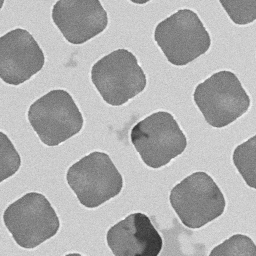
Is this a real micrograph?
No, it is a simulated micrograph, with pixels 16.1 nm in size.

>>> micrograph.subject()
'a regular array of holes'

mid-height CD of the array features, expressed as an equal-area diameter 53.8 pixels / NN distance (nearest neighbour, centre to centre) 1170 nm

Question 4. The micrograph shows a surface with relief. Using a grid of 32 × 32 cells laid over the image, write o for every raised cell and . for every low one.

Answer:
ooooooo......ooooooooooooooo....
oooooo.......ooooooooo..oooo....
ooooooo......ooooooo.....oooo...
ooooooo......oooooo.......oooooo
....oooo....ooooooo.......oooooo
.....oooo.oooooooooo......oooooo
.....ooooooooo..oooo......oooooo
......oooooo.....oooo...oooooooo
.....ooooooo......oooooooooooooo
....ooooooo.......oooooooo....oo
o.oooooooooo......ooooooo.....oo
oooooo..oooo......oooooo.......o
ooooo....oooo...oooooooo.......o
oooo......ooooooooooooooo......o
ooo.......ooooooooo...ooo.....oo
oooo......ooooooo.....oooo...ooo
oooo......oooooo.......ooooooooo
.oooo...oooooooo.......oooooooo.
..ooooooooooooooo......oooooo...
..ooooooooo...ooo.....ooooooo...
...oooooo.....oooo...oooooooo...
..oooooo.......ooooooooooooooo..
.ooooooo.......oooooooo....ooo..
ooooooooo......ooooooo.....ooooo
ooo...ooo.....ooooooo.......oooo
o.....oooo...oooooooo.......oooo
o......ooooooooooooooo......oooo
.......oooooooo....oooo....ooooo
o......ooooooo.....ooooo.ooooooo
o......oooooo.......ooooooooo..o
oo...oooooooo.......ooooooo.....
oooooooooooooo......oooooo......